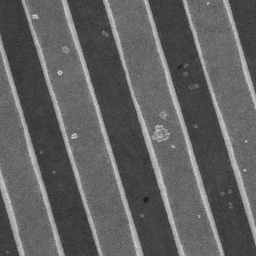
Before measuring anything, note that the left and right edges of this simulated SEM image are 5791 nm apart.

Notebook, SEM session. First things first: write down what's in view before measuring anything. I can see lines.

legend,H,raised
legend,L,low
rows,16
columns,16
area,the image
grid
LLHHLLLHHLLLHHLL
LLHHLLLHHHLLHHHL
LLHHHLLHHHLLHHHL
LLLHHLLLHHLLLHHL
HLLHHLLLHHHLLHHL
HLLHHHLLHHHLLHHH
HLLHHHLLHHHLLHHH
HLLLHHLLLHHLLLHH
HHLLHHHLLHHHLLHH
HHLLHHHLLHHHLLHH
HHLLLHHLLLHHLLLH
HHHLLHHHLLHHHLLH
HHHLLHHHLLHHHLLH
LHHLLLHHLLLHHLLL
LHHHLLHHLLLHHLLL
LHHHLLHHHLLHHHLL